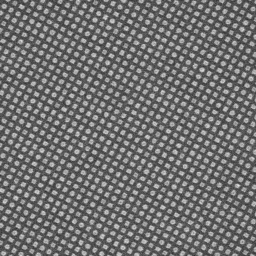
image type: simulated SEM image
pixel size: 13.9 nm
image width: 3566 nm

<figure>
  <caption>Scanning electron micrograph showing a regular array of raised bodies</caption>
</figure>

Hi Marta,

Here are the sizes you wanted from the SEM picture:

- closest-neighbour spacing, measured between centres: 105 nanometers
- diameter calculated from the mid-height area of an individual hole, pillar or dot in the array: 58.8 nanometers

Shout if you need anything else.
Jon